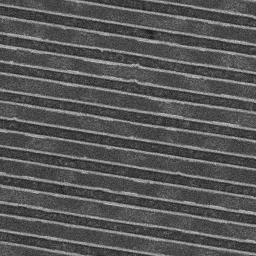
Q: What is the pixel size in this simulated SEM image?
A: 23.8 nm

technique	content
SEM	parallel lines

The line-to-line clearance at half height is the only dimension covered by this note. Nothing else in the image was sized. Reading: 0.282 micrometres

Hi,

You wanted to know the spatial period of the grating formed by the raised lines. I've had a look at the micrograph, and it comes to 661 nm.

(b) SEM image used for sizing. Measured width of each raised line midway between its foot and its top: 381 nanometers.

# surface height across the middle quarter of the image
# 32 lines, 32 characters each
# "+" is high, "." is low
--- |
++++++++++++++++.++.............
++++++++++++++++++++++..........
.....++++++++++++++++++++++++...
...........+++++++++++++++++++++
..................++++++++++++++
++++....................++++++++
++++++++++...................+++
+++++++++++++++++...............
++++++++++++++++++++++..........
....++++++++++++++++++++++++....
...........+++++++++++++++++++++
.................+++++++++++++++
+++....................+++++++++
++++++++++....................++
+++++++++++++++.................
+++++++++++++++++++++...........
....+++++++++++++++++++++++++...
..........++++++++++++++++++++++
................++++++++++++++++
+++....................+++++++++
+++++++++....................+++
++++++++++++++++................
++++++++++++++++++++++..........
....++++++++++++++++++++++++....
...........+++++++++++++++++++++
.................+++++++++++++++
++....................++++++++++
+++++++++....................+++
+++++++++++++++.................
+++++++++++++++++++++...........
....++++++++++++++++++++++++....
..........++++++++++++++++++++++